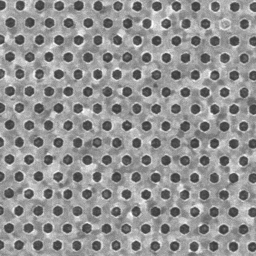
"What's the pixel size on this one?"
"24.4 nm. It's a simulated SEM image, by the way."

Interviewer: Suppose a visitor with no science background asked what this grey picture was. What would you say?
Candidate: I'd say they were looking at a regular array of holes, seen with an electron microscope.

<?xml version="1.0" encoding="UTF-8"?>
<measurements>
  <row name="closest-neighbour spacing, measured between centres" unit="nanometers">473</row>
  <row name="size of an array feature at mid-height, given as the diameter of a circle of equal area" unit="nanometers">257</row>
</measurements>